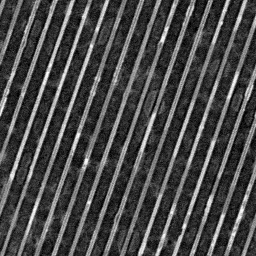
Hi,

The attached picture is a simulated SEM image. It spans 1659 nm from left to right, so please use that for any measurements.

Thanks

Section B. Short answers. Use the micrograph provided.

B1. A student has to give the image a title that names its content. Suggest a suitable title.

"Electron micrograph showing parallel lines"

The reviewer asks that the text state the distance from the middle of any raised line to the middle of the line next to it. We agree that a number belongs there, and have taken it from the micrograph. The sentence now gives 106 nm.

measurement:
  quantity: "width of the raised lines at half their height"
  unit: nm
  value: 23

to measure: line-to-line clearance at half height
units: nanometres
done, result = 81.9